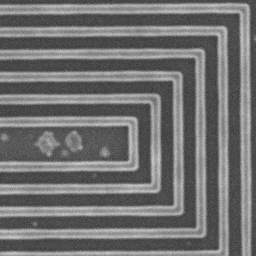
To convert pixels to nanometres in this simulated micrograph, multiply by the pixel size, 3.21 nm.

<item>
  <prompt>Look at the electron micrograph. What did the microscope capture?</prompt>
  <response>groups of lines, slits or small figures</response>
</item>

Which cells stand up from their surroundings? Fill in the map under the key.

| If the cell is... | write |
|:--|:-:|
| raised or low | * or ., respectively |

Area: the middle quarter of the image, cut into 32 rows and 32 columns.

................................
................................
*****************************...
*****************************...
............................*...
............................*...
............................*...
............................*...
************************....*...
************************....*...
......................**....*...
......................**....*...
......................**....**..
******************....**....**..
******************....**....**..
................**....**....**..
................**....**....**..
................**....**....**..
................**....**....**..
................**....**....**..
.................*....**....**..
.................*....**....**..
................**....**....**..
................**....**....**..
................**....**....**..
******************....**....**..
******************....**....**..
......................**....**..
......................**....**..
......................**....**..
************************....**..
************************....**..